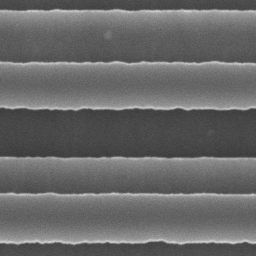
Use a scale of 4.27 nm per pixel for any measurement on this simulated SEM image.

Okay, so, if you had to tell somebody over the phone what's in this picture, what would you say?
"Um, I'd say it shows lines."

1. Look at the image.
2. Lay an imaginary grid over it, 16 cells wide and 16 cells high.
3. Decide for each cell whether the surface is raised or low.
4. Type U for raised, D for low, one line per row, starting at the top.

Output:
DDDDDDDDDDDDDDDD
UUUUUUUUUUUUUUUU
UUUUUUUUUUUUUUUU
UUUUUUUUUUUUUUUU
UUUUUUUUUUUUUUUU
UUUUUUUUUUUUUUUU
UUUUUUUUUUUUUUUU
DDDDDDDDDDDDDDDD
DDDDDDDDDDDDDDDD
DDDDDDDDDDDDDDDD
UUUUUUUUUUUUUUUU
UUUUUUUUUUUUUUUU
UUUUUUUUUUUUUUUU
UUUUUUUUUUUUUUUU
UUUUUUUUUUUUUUUU
DDDDDDDDDDDDDDDD